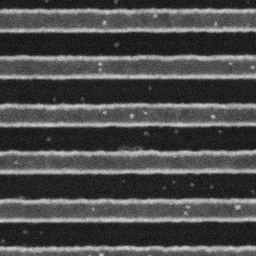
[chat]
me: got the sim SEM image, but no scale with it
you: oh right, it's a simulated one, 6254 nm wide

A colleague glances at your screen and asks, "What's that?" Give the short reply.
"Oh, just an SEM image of lines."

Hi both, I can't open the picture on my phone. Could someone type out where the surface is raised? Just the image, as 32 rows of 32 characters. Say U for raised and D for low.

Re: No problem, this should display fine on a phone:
DDDDDDDDDDDDDDDDDDDDDDDDDDDDDDDD
UUUUUUUUUUUUUUUUUUUUUUUUUUUUUUUU
UUUUUUUUUUUUUUUUUUUUUUUUUUUUUUUU
UUUUUUUUUUUUUUUUUUUUUUUUUUUUUUUU
DDDDDDDDDDDDDDDDDDDDDDDDDDDDDDDD
DDDDDDDDDDDDDDDDDDDDDDDDDDDDDDDD
DDDDDDDDDDDDDDDDDDDDDDDDDDDDDDDD
UUUUUUUUUUUUUUUUUUUUUUUUUUUUUUUU
UUUUUUUUUUUUUUUUUUUUUUUUUUUUUUUU
UUUUUUUUUUUUUUUUUUUUUUUUUUUUUUUU
DDDDDDDDDDDDDDDDDDDDDDDDDDDDDDDD
DDDDDDDDDDDDDDDDDDDDDDDDDDDDDDDD
DDDDDDDDDDDDDDDDDDDDDDDDDDDDDDDD
UUUUUUUUUUUUUUUUUUUUUUUUUUUUUUUU
UUUUUUUUUUUUUUUUUUUUUUUUUUUUUUUU
UUUUUUUUUUUUUUUUUUUUUUUUUUUUUUUU
DDDDDDDDDDDDDDDDDDDDDDDDDDDDDDDD
DDDDDDDDDDDDDDDDDDDDDDDDDDDDDDDD
DDDDDDDDDDDDDDDDDDDDDDDDDDDDDDDD
UUUUUUUUUUUUUUUUUUUUUUUUUUUUUUUU
UUUUUUUUUUUUUUUUUUUUUUUUUUUUUUUU
UUUUUUUUUUUUUUUUUUUUUUUUUUUUUUUU
DDDDDDDDDDDDDDDDDDDDDDDDDDDDDDDD
DDDDDDDDDDDDDDDDDDDDDDDDDDDDDDDD
DDDDDDDDDDDDDDDDDDDDDDDDDDDDDDDD
UUUUUUUUUUUUUUUUUUUUUUUUUUUUUUUU
UUUUUUUUUUUUUUUUUUUUUUUUUUUUUUUU
UUUUUUUUUUUUUUUUUUUUUUUUUUUUUUUU
DDDDDDDDDDDDDDDDDDDDDDDDDDDDDDDD
DDDDDDDDDDDDDDDDDDDDDDDDDDDDDDDD
DDDDDDDDDDDDDDDDDDDDDDDDDDDDDDDD
UUUUUUUUUUUUUUUUUUUUUUUUUUUUUUUU